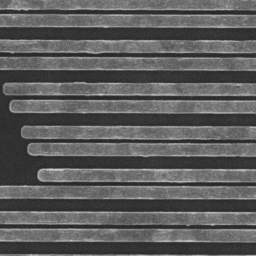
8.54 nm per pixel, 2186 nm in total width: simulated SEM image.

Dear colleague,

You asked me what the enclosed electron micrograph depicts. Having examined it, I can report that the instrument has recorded parallel lines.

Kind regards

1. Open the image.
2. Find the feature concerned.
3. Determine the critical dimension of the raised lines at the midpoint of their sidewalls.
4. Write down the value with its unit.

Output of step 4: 105 nm